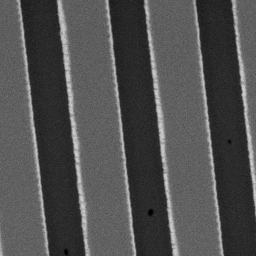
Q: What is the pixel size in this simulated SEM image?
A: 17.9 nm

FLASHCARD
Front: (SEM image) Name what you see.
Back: lines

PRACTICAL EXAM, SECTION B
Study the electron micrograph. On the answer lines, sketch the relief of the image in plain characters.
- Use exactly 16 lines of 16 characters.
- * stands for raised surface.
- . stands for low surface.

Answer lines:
*...***..***...*
*...***..***...*
**..***..***...*
**..***..****..*
**..***...***..*
**..***...***..*
**..***...***..*
**...***..***..*
**...***..***...
**...***..***...
**...***..***...
***..***..***...
***..***...***..
***..***...***..
***..***...***..
***..***...***..